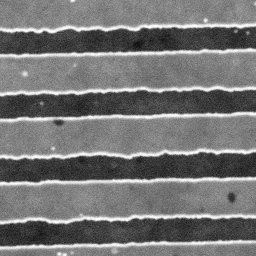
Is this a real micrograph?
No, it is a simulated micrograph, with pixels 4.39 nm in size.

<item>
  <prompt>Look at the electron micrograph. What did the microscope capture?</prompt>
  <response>lines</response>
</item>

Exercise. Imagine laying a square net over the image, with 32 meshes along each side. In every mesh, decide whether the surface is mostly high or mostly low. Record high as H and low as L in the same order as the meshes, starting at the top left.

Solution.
HHHHHHHHHHHHHHHHHHHHHHHHHHHHHHHH
HHHHHHHHHHHHHHHHHHHHHHHHHHHHHHHH
HHHHHHHHHHHHHHHHHHHHHHHHHHHHHHHH
HHHHHHHHHHHHHHHLHHLLLLLLLLLLLLLL
LLLLLLLLLLLLLLLLLLLLLLLLLLLLLLLL
LLLLLLLLLLLLLLLLLLLLLLLLLLLLLLLL
LLLLLLLLLLLLLLLLLLLLHHHHHHHHHHHH
HHHHHHHHHHHHHHHHHHHHHHHHHHHHHHHH
HHHHHHHHHHHHHHHHHHHHHHHHHHHHHHHH
HHHHHHHHHHHHHHHHHHHHHHHHHHHHHHHH
HHHHHHHHHHHHHHHHHHHHHHHHHHHHHHHH
HHHHHHHHHHHLLLLLLLLLLLLLLLLLLLLL
LLLLLLLLLLLLLLLLLLLLLLLLLLLLLLLL
LLLLLLLLLLLLLLLLLLLLLLLLLLLLLLLL
LLLLLLLLLLLLLLHHLLLHHHHHHHHHHHHH
HHHHHHHHHHHHHHHHHHHHHHHHHHHHHHHH
HHHHHHHHHHHHHHHHHHHHHHHHHHHHHHHH
HHHHHHHHHHHHHHHHHHHHHHHHHHHHHHHH
HHHHHHHHHHHHHHHHHHHHHHHHHHHHHHHH
HHHHHHHHHHLLLLLHHLLLLLLLLLLLLLLL
LLLLLLLLLLLLLLLLLLLLLLLLLLLLLLLL
LLLLLLLLLLLLLLLLLLLLLLLLLLLLLLLL
LLLLLLLLLLLLLLLLLLLHHHHHHHHHHHHH
HHHHHHHHHHHHHHHHHHHHHHHHHHHHHHHH
HHHHHHHHHHHHHHHHHHHHHHHHHHHHHHHH
HHHHHHHHHHHHHHHHHHHHHHHHHHHHHHHH
HHHHHHHHHHHHHHHHHHHHHHHHHHHHHHHH
HHHHHHHHHHLLHHHHLLLLLLLLLLLLLLLL
LLLLLLLLLLLLLLLLLLLLLLLLLLLLLLLL
LLLLLLLLLLLLLLLLLLLLLLLLLLLLLLLL
LLLLLLLLLLLLLLLLHLHHHHHHHHHHHHHH
HHHHHHHHHHHHHHHHHHHHHHHHHHHHHHHH